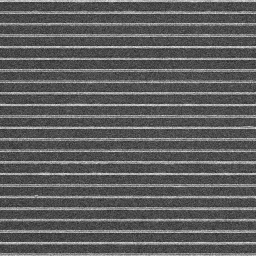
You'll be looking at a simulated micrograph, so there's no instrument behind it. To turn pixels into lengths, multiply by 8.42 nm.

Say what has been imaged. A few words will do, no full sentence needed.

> parallel lines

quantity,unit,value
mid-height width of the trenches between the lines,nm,77.9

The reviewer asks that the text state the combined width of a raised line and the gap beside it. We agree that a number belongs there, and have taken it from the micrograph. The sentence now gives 96.9 nanometres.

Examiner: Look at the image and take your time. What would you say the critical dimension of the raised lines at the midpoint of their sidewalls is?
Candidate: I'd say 17.9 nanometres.